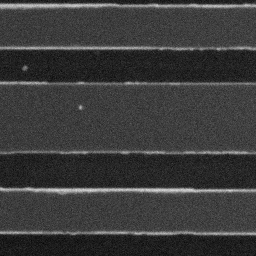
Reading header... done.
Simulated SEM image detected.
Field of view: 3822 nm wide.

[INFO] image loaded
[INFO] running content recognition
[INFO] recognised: lines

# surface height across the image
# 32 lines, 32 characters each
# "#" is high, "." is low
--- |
................................
################################
################################
################################
################################
################################
................................
................................
................................
................................
################################
################################
################################
################################
################################
################################
################################
################################
################################
................................
................................
................................
................................
................................
################################
################################
################################
################################
################################
................................
................................
................................